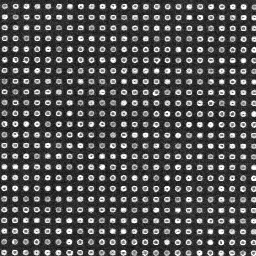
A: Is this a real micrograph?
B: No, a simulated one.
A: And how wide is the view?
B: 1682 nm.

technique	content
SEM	a regular array of raised bodies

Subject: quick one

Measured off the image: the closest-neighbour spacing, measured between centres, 10.5 pixels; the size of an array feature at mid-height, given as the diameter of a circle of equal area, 36.3 nm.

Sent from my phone